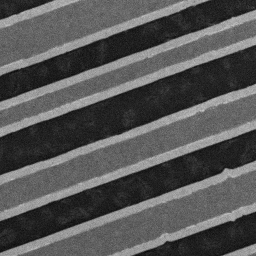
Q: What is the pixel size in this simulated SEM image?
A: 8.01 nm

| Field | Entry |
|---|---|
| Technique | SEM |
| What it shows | one or a few lines or trenches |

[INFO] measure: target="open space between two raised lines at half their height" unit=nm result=304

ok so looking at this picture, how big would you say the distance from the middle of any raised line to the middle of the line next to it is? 589 nanometers